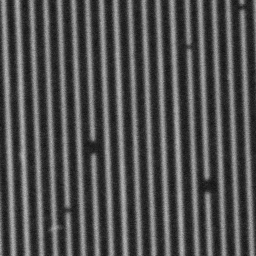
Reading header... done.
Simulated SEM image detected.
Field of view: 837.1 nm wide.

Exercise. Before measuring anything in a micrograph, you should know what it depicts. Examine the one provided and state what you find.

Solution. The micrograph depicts parallel lines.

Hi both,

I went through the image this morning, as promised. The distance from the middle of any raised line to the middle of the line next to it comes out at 0.0459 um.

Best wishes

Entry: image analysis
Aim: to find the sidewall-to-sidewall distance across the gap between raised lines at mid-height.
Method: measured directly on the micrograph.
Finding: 33.9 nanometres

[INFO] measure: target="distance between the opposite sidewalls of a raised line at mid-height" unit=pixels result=3.49